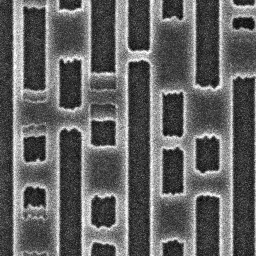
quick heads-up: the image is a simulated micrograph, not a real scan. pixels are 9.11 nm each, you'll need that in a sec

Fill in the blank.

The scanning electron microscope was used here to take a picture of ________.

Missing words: parallel lines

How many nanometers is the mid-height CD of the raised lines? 104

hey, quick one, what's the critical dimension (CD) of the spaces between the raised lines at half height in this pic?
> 215 nanometres